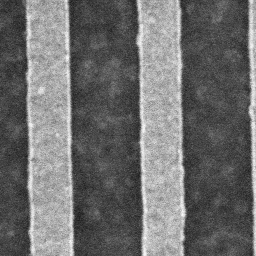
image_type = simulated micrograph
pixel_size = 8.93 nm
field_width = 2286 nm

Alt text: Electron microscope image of one or a few lines or trenches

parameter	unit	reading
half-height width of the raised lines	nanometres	339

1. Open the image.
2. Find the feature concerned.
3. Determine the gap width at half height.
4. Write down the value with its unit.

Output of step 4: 73.1 pixels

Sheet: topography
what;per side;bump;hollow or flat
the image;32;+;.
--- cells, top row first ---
...+++++.........+++++.........+
....++++.........+++++.........+
....++++..........++++.........+
....++++..........++++.........+
....++++..........++++.........+
...+++++..........++++.........+
...+++++..........++++.........+
....++++..........++++.........+
....++++..........++++..........
....++++..........++++..........
....+++++.........++++..........
....++++..........++++..........
....+++++.........++++..........
....+++++.........++++.........+
....+++++.........++++.........+
....+++++.........+++++.........
....+++++.........+++++.........
....+++++.........+++++.........
....+++++.........++++..........
....+++++.........++++..........
....+++++.........++++..........
....+++++.........+++++.........
....+++++.........+++++.........
....+++++.........+++++.........
....+++++.........+++++.........
....+++++.........+++++.........
....+++++.........+++++.........
....+++++.........+++++.........
....+++++.........+++++.........
....+++++.........+++++.........
....+++++.........+++++.........
....+++++.........+++++.........